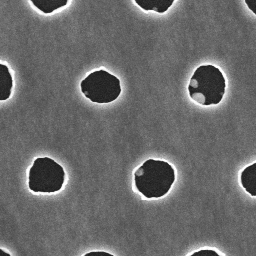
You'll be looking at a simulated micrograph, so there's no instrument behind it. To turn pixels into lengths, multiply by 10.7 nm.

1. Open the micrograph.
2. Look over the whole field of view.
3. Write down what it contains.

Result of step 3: holes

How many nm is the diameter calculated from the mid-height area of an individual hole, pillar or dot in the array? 402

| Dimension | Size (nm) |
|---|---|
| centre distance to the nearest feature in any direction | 1120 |